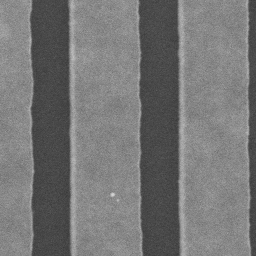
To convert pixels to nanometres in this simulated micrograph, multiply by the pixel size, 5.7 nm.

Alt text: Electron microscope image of lines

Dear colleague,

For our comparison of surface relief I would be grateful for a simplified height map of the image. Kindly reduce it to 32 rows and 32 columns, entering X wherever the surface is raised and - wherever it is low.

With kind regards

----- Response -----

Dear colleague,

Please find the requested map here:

XXXX-----XXXXXXXX-----XXXXXXXXX-
XXXX-----XXXXXXXX-----XXXXXXXXX-
XXXX-----XXXXXXXX-----XXXXXXXXX-
XXXX-----XXXXXXXX-----XXXXXXXXX-
XXXX-----XXXXXXXX-----XXXXXXXXX-
XXXX-----XXXXXXXX-----XXXXXXXXX-
XXXX-----XXXXXXXXX----XXXXXXXXX-
XXXX-----XXXXXXXX-----XXXXXXXXX-
XXXX-----XXXXXXXX-----XXXXXXXXX-
XXXX-----XXXXXXXX-----XXXXXXXXX-
XXXX-----XXXXXXXX-----XXXXXXXXX-
XXXX-----XXXXXXXX-----XXXXXXXXX-
XXXX-----XXXXXXXX-----XXXXXXXXX-
XXXX-----XXXXXXXXX-----XXXXXXXX-
XXXX-----XXXXXXXXX-----XXXXXXXX-
XXXX-----XXXXXXXX------XXXXXXXX-
XXXX-----XXXXXXXX-----XXXXXXXXX-
XXXX-----XXXXXXXX------XXXXXXXX-
XXXX-----XXXXXXXXX----XXXXXXXXX-
XXXX-----XXXXXXXXX----XXXXXXXXX-
XXXX-----XXXXXXXX-----XXXXXXXXX-
XXXX-----XXXXXXXX------XXXXXXXX-
XXXX-----XXXXXXXX-----XXXXXXXXX-
XXXX-----XXXXXXXX-----XXXXXXXXX-
XXXX-----XXXXXXXXX----XXXXXXXXX-
XXXX-----XXXXXXXXX----XXXXXXXXX-
XXXX-----XXXXXXXX-----XXXXXXXXX-
XXXX-----XXXXXXXXX----XXXXXXXXX-
XXXX-----XXXXXXXXX-----XXXXXXXX-
XXXX-----XXXXXXXXX-----XXXXXXXX-
XXXX-----XXXXXXXXX-----XXXXXXXX-
XXXX-----XXXXXXXXX-----XXXXXXXX-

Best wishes